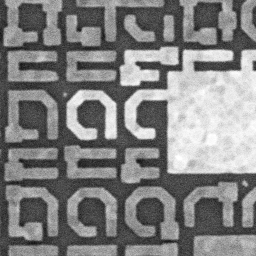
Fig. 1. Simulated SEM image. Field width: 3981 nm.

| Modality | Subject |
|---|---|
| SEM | wiring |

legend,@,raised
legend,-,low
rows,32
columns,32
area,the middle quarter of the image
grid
-@@------------@@@------------@@
-@@@----------@@@@@-----------@@
-@@@@@@@@@@@@-@@@@@@@@@@--@@@@@@
-@@@@@@@@@@@@-@@@@@@@@@@--@@@@@@
--------------@@@@@-------@@@@@@
--------------------------@@@@@@
--------------------------@@@@@@
---@@@@@@@--------@@@@@@@@@@@@@@
--@@@@@@@@@------@@@@@@@@@@@@@@@
-@@@-----@@@----@@@-------@@@@@@
-@@-------@@@---@@--------@@@@@@
-@@--------@@---@@--------@@@@@@
-@@--------@@---@@--------@@@@@@
-@@--------@@---@@--------@@@@@@
-@@--------@@---@@--------@@@@@@
-@@@-------@@---@@@-------@@@@@@
--@@@@@@---@@---@@@@@@----@@@@@@
---@@@@@---@@----@@@@@----@@@@@@
----@@@@---@--------------@@@@@@
--------------------------@@@@@@
--------------------------@@@@@@
@@@@@@@@@@@@@---@@@@@@@@--@@@@@@
@@@@@@@@@@@@@---@@@@@@@@--@@@@@@
@@@@------------@@@@------@@@@@@
-@@-------------@@--------@@@@@@
-@@------------@@@@-------@@@@@@
-@@@@@@@@@@@@-@@@@@@@@@@--@@@@@@
-@@@@@@@@@@@@-@@@@@@@@@@--------
--------------@@@@@-------------
---------------@@@--------------
--------------------------------
----@@@@@@--------@@@@@@@-------